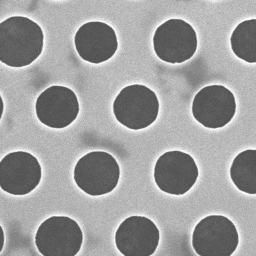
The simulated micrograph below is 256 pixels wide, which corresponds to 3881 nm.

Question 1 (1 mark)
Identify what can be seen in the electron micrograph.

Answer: holes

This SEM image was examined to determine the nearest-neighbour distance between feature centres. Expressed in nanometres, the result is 1150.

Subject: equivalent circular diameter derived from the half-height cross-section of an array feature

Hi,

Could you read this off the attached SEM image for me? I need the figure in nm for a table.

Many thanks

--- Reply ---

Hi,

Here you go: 673